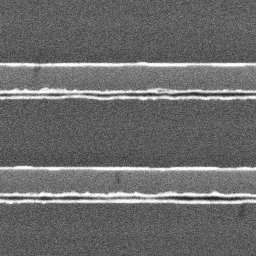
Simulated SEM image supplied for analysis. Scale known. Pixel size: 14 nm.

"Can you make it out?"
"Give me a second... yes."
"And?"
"lines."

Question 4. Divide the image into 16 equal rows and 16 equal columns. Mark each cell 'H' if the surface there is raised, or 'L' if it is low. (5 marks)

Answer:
LLLLLLLLLLLLLLLL
LLLLLLLLLLLLLLLL
LLLLLLLLLLLLLLLL
LLLLLLLLLLLLLLLL
HHHHHHHHHHHHHHHH
HHHHHHHHHHHHHHHH
LLLLLLLLLLLLLLLL
LLLLLLLLLLLLLLLL
LLLLLLLLLLLLLLLL
LLLLLLLLLLLLLLLL
HHHHHHLHLLLHHLLL
HHHHHHHHHHHHHHHH
HHHHHHHHHHHHHHHH
LLLLLLLLLLLLLLLL
LLLLLLLLLLLLLLLL
LLLLLLLLLLLLLLLL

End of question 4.